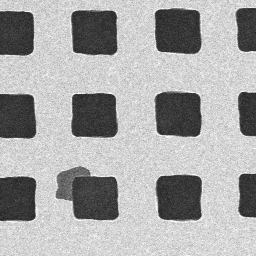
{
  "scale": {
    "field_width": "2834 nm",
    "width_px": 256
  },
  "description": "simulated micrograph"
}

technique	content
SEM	holes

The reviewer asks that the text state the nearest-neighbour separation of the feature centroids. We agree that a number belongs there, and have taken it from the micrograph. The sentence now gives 919 nanometres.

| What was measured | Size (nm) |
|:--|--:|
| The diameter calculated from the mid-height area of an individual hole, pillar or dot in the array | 550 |